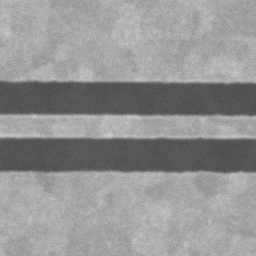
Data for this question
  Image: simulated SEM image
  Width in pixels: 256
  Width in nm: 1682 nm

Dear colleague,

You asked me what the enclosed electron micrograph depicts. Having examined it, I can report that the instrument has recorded lines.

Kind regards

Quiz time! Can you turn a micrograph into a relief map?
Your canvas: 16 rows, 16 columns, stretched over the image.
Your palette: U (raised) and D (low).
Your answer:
UUUUUUUUUUUUUUUU
UUUUUUUUUUUUUUUU
UUUUUUUUUUUUUUUU
UUUUUUUUUUUUUUUU
UUUUUUUUUUUUUUUU
DDDDDDDDDDDDDDDD
DDDDDDDDDDDDDDDD
UUUUUUUUUUUUUUUU
UUUUUUUUUUUUUUUU
DDDDDDDDDDDDDDDD
DDDDDDDDDDDDDDDD
UUUUUUUUUUUUUUUU
UUUUUUUUUUUUUUUU
UUUUUUUUUUUUUUUU
UUUUUUUUUUUUUUUU
UUUUUUUUUUUUUUUU